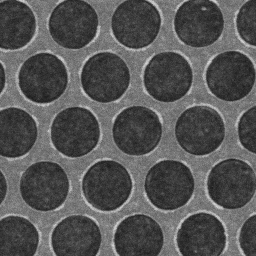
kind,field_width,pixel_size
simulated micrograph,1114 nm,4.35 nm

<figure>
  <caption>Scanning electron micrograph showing a regular array of holes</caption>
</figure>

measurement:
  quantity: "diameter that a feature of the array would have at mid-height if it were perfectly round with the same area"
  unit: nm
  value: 218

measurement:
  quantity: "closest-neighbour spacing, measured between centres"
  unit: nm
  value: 270